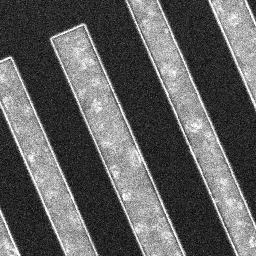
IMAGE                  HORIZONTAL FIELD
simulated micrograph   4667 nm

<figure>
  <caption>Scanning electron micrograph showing one or a few lines or trenches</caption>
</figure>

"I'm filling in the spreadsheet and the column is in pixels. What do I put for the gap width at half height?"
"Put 27.9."